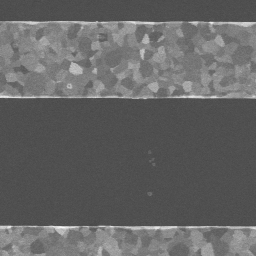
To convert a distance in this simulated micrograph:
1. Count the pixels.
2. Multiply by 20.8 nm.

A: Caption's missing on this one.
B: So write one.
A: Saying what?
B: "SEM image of wiring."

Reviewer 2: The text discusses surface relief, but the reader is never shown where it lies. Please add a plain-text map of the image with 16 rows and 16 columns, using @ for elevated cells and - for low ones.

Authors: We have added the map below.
----------------
@@@@@@@@@@@@@@@@
@@@@@@@@@@@@@@@@
@@@@@@@@@@@@@@@@
@@@@@@@@@@@@@@@@
@@@@@@@@@@@@@@@@
----------------
----------------
----------------
----------------
----------------
----------------
----------------
----------------
@@@@@@@@@@@@@@@@
@@@@@@@@@@@@@@@@